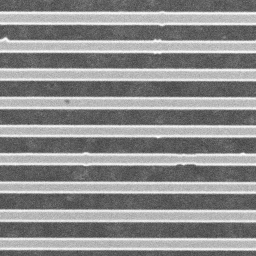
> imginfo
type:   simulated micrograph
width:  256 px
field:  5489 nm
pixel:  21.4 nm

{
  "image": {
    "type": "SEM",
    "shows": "parallel lines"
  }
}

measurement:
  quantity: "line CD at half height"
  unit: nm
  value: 233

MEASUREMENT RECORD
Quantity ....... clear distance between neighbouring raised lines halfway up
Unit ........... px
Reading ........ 17.1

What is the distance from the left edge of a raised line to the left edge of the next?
606 nanometres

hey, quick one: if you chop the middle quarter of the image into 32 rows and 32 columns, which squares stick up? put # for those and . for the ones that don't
................................
################################
################################
################################
................................
................................
................................
................................
#####################.##########
################################
################################
................................
................................
................................
................................
................................
################################
################################
................................
................................
................................
................................
.....#..........................
################################
################################
................................
................................
................................
................................
................................
################################
################################